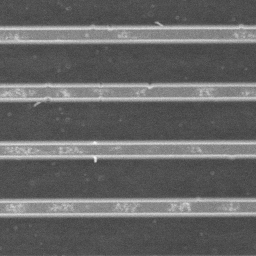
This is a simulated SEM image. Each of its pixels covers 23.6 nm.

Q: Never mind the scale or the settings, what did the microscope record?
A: parallel lines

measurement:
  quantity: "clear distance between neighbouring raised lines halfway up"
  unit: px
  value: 42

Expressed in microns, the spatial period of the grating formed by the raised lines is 1.36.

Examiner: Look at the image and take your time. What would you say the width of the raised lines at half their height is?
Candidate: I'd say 374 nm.